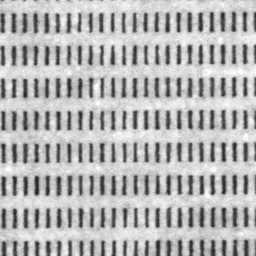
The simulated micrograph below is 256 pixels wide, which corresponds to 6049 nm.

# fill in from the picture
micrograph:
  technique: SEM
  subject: a regular array of holes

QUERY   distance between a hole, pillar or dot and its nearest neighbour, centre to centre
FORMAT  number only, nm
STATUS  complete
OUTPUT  260